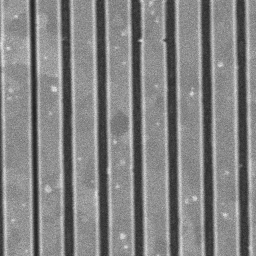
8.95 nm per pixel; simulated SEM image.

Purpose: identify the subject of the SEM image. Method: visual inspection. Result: parallel lines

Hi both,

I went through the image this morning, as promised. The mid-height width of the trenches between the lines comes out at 0.0973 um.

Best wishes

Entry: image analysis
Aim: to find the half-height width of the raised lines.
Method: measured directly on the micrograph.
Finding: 218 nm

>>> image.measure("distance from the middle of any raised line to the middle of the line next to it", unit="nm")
310